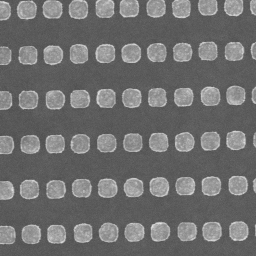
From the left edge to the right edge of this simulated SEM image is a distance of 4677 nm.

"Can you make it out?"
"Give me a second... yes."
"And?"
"a regular array of raised bodies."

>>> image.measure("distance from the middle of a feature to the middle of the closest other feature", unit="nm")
468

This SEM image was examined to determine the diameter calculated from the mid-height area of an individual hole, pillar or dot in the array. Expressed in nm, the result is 354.